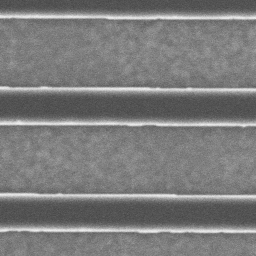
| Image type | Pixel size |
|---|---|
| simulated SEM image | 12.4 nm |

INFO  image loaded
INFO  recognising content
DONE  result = lines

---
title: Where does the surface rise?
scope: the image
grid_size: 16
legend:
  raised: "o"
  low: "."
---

oooooooooooooooo
................
................
................
................
................
oooooooooooooooo
oooooooooooooooo
................
................
................
................
oooooooooooooooo
oooooooooooooooo
................
................